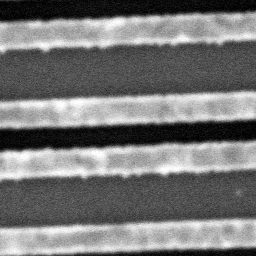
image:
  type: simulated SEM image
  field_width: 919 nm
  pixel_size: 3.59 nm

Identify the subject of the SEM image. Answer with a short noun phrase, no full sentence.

lines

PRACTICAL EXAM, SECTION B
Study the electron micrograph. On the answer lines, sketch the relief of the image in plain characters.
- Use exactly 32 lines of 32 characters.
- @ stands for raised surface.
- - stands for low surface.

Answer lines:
--------------------------------
--------------------------------
-------@--@@@@@@@@@@@@@@@@@@@@@@
@@@@@@@@@@@@@@@@@@@@@@@@@@@@@@@@
@@@@@@@@@@@@@@@@@@@@@@@@@@@@@@@@
@@@@@@@@@@@@@@------------------
--------------------------------
--------------------------------
--------------------------------
--------------------------------
--------------------------------
--------------------------------
----------@@@@@@@@@@@@@@@@@@@@@@
@@@@@@@@@@@@@@@@@@@@@@@@@@@@@@@@
@@@@@@@@@@@@@@@@@@@@@@@@@@@@@@@@
@@@@@@@@@@@@@@------------------
--------------------------------
--------------------------------
-------------@@@@@@@@@@@@@@@@@@@
@@@@@@@@@@@@@@@@@@@@@@@@@@@@@@@@
@@@@@@@@@@@@@@@@@@@@@@@@@@@@@@@@
@@@@@@@@@@@@@@@@@---------------
--------------------------------
--------------------------------
--------------------------------
--------------------------------
--------------------------------
--------------------------------
------@@@@@@@@@@@@@@@@@@@@@@@@@@
@@@@@@@@@@@@@@@@@@@@@@@@@@@@@@@@
@@@@@@@@@@@@@@@@@@@@@@@@@@@@@@@@
@@@@@@@@@@@@@-------------------